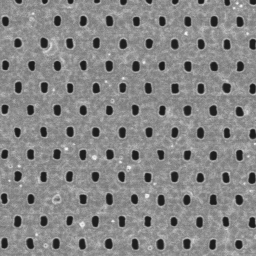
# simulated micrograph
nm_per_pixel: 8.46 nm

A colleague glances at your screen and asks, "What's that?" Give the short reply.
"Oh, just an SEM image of a regular array of holes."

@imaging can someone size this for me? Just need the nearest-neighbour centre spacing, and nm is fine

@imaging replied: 213